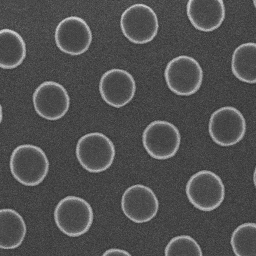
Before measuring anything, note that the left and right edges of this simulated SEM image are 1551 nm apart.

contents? a regular array of raised bodies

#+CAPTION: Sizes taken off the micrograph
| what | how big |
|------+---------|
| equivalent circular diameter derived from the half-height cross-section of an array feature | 222 nm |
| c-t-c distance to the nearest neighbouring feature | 408 nm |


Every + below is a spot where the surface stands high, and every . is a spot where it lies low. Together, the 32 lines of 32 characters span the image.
........................++++....
................+++.....++++....
........++.....+++++....++++....
.......++++....+++++.....++.....
++.....++++.....+++.............
+++....++++....................+
+++.....++...................+++
+++...................++.....+++
.....................++++....+++
.............+++.....++++.....++
......+......++++....++++.......
.....+++.....++++.....++........
....+++++....+++................
....++++....................+...
.....+++...................+++..
...................++.....+++++.
..................++++....++++..
..........++++....++++.....+++..
..+++.....++++....++++..........
..++++....++++.....++...........
.+++++....++++..................
..++++...................+......
..+++...................+++.....
................++.....+++++....
...............++++.....++++....
.......++++....+++++....+++.....
++.....++++.....++++............
+++....++++......+..............
+++.....+++...................++
+++..........................+++
++...................++++....+++
.............+++.....++++....+++